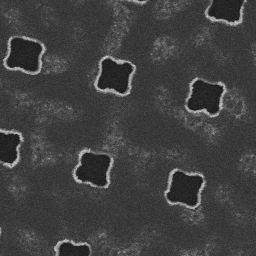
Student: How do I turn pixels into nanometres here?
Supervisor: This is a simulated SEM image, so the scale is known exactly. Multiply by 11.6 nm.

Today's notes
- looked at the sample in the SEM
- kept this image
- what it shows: holes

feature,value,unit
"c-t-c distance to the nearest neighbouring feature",1070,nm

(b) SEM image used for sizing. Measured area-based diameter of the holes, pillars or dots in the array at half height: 385 nm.